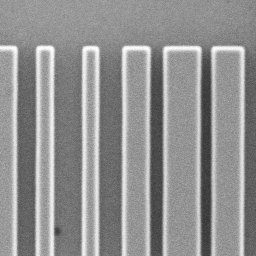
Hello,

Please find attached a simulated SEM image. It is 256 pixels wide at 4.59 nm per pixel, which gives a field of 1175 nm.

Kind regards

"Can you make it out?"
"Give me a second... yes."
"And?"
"groups of lines, slits or small figures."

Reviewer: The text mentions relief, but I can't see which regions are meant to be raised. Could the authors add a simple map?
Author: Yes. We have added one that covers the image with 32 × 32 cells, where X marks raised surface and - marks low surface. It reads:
--------------------------------
--------------------------------
--------------------------------
--------------------------------
--------------------------------
--------------------------------
XX---XX----X---XXXX--XXXX--XXX--
XX---XX----X---XXXX--XXXX--XXX--
XX---XX---XX---XXXX--XXXX--XXX--
XX---XX---XX---XXXX--XXXX--XXX--
XX---XX---XX---XXXX--XXXX--XXX--
XX---XX---XX---XXXX--XXXX--XXX--
XX---XX---XX---XXXX--XXXX--XXX--
XX---XX---XX---XXXX--XXXX--XXX--
XX---XX---XX---XXXX--XXXX--XXX--
XX---XX---XX---XXXX--XXXX--XXX--
XX---XX---XX---XXXX--XXXX--XXX--
XX---XX----X---XXXX--XXXX--XXX--
XX---XX----X---XXXX--XXXX--XXX--
XX---XX----X---XXXX--XXXX--XXX--
XX---XX---XX---XXXX--XXXX--XXX--
XX---XX---XX---XXXX--XXXX--XXX--
XX---XX---XX---XXXX--XXXX--XXX--
XX---XX---XX---XXXX--XXXX--XXX--
XX---XX---XX---XXXX-XXXXX--XXX--
XX---XX---XX---XXXX-XXXXX--XXX--
XX---XX---XX---XXXX-XXXXX--XXX--
XX---XX---XX---XXXX-XXXXX--XXX--
XX---XX---XX---XXXX-XXXXX--XXX--
XX---XX---XX---XXXX-XXXXX--XXX--
XX---XX---XX---XXXX-XXXXX--XXX--
XX---XX---XX---XXXX-XXXXX--XXX--